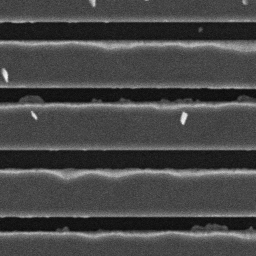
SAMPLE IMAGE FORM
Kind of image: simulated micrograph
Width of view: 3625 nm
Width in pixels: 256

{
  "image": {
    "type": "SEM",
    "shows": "lines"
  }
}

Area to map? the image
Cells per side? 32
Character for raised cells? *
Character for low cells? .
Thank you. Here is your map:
********************************
********************************
********************************
................................
................................
********************************
********************************
********************************
********************************
********************************
********************************
................................
................................
********************************
********************************
********************************
********************************
********************************
********************************
................................
................................
********************************
********************************
********************************
********************************
********************************
********************************
................................
................................
********************************
********************************
********************************